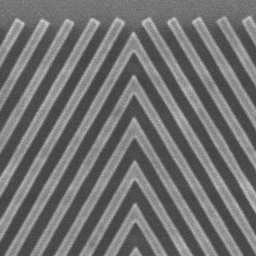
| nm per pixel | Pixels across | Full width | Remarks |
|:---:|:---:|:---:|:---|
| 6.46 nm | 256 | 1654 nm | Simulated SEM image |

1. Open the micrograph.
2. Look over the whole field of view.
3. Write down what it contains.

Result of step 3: groups of lines, slits or small figures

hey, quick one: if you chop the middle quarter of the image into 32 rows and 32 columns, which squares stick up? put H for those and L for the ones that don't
HHHLLLHHHLLLLHHLLLLLHHLLLLHHHLLL
HHLLLLHHLLLLHHHLLLLLHHHLLLLHHLLL
HHLLLHHHLLLHHHLLLLLLLHHHLLLHHHLL
HLLLHHHLLLLHHLLLLHLLLLHHLLLLHHHL
LLLLHHHLLLHHHLLLHHLLLLHHHLLLHHHL
LLLHHHLLLLHHLLLLHHHLLLLHHLLLLHHH
LLLHHHLLLHHHLLLHHHHHLLLHHHLLLLHH
LLHHHLLLHHHLLLLHHHHHLLLLHHHLLLHH
LLHHLLLLHHHLLLHHHLHHHLLLLHHLLLLH
LHHHLLLHHHLLLHHHLLLHHHLLLHHHLLLH
LHHLLLLHHLLLLHHHLLLHHHLLLLHHLLLL
HHHLLLHHHLLLLHHLLLLLHHHLLLLHHLLL
HHLLLLHHLLLLHHLLLLLLLHHLLLLHHHLL
HLLLLHHHLLLHHHLLLLLLLHHHLLLLHHLL
HLLLHHHLLLLHHLLLLHLLLLHHLLLLHHHL
LLLLHHHLLLHHHLLLHHHLLLHHHLLLLHHL
LLLLHHLLLHHHLLLLHHHLLLLHHHLLLHHH
LLLHHLLLLHHHLLLHHHHHLLLLHHLLLLHH
LLHHHLLLHHHLLLLHHHHHHLLLHHHLLLLH
LLHHLLLLHHLLLLHHHLHHHLLLLHHLLLLH
LHHHLLLHHHLLLHHHLLLHHHLLLLHHLLLL
HHHLLLLHHLLLLHHLLLLLHHLLLLHHHLLL
HHHLLLHHHLLLHHHLLLLLLHHLLLLHHLLL
HHLLLHHHLLLLHHLLLLLLLHHLLLLHHHLL
HLLLLHHHLLLHHHLLLLLLLLHHLLLLHHHL
HLLLHHHLLLHHHLLLLHHLLLHHHLLLLHHL
LLLLHHLLLLHHHLLLHHHLLLLHHLLLLHHH
LLLHHHLLLHHHLLLLHHHHLLLHHHLLLLHH
LLLHHLLLLHHHLLLHHHHHLLLLHHHLLLHH
LLHHHLLLHHHLLLLHHLHHHLLLLHHLLLLH
LHHHLLLLHHLLLLHHHLLHHHLLLHHHLLLL
LHHHLLLHHHLLLHHHLLLLHHLLLLHHLLLL